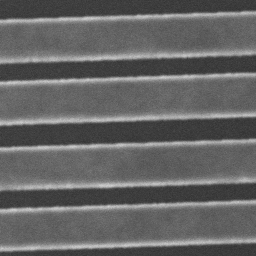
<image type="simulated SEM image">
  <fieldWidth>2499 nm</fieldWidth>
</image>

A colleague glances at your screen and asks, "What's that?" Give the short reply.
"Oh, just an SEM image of lines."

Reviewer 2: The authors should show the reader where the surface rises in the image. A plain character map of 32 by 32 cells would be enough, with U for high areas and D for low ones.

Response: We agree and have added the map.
DDDDDDDDDDDDDDDDDDDDDDDDDDDDDDDD
DDDDDDDDDDDDDDDDDDDDDDDDDDDDDDDD
DUUUUUUUUUUUUUUUUUUUUUUUUUUUUUUU
UUUUUUUUUUUUUUUUUUUUUUUUUUUUUUUU
UUUUUUUUUUUUUUUUUUUUUUUUUUUUUUUU
UUUUUUUUUUUUUUUUUUUUUUUUUUUUUUUU
UUUUUUUUUUUUUUUUUUUUUUUUUUUUUUUU
UUUUUDDDDDDDDDDDDDDDDDDDDDDDDDDD
DDDDDDDDDDDDDDDDDDDDDDDDDDDDDDDD
DDDDDDDDDDDDDDDDDDDDDDDUUUUUUUUU
UUUUUUUUUUUUUUUUUUUUUUUUUUUUUUUU
UUUUUUUUUUUUUUUUUUUUUUUUUUUUUUUU
UUUUUUUUUUUUUUUUUUUUUUUUUUUUUUUU
UUUUUUUUUUUUUUUUUUUUUUUUUUUUUUUU
UUUUUUUUUUUUUUUUUUUUUUUUUUUUUUUD
UUDDDDDDDDDDDDDDDDDDDDDDDDDDDDDD
DDDDDDDDDDDDDDDDDDDDDDDDDDDDDDDD
DDDDDDDDDDDDDDDDDDDDDDDDDDDDDDDU
DUUUUUUUUUUUUUUUUUUUUUUUUUUUUUUU
UUUUUUUUUUUUUUUUUUUUUUUUUUUUUUUU
UUUUUUUUUUUUUUUUUUUUUUUUUUUUUUUU
UUUUUUUUUUUUUUUUUUUUUUUUUUUUUUUU
UUUUUUUUUUUUUUUUUUUUUUUUUUUUUUUU
DDUUUUDDDDDDDDDDDDDDDDDDDDDDDDDD
DDDDDDDDDDDDDDDDDDDDDDDDDDDDDDDD
DDDDDDDDDDDDDDDDDDDUUUUUUUUUUUUU
UUUUUUUUUUUUUUUUUUUUUUUUUUUUUUUU
UUUUUUUUUUUUUUUUUUUUUUUUUUUUUUUU
UUUUUUUUUUUUUUUUUUUUUUUUUUUUUUUU
UUUUUUUUUUUUUUUUUUUUUUUUUUUUUUUU
UUUUUUUUUUUUUUUUUUUUUUUUUDDDDDDD
DDDDDDDDDDDDDDDDDDDDDDDDDDDDDDDD